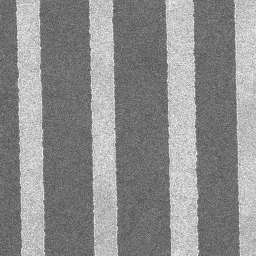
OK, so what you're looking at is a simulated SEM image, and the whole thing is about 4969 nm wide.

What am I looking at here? one or a few lines or trenches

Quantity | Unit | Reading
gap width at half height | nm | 980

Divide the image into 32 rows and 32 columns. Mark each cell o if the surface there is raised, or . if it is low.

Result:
..ooo......ooo.......ooo.....ooo
..ooo......ooo.......ooo.....ooo
..ooo......ooo.......ooo.....ooo
..ooo......ooo.......ooo.....ooo
..ooo......ooo.......ooo.....ooo
..ooo......ooo.......ooo.....ooo
..ooo......ooo.......ooo......oo
..ooo......ooo.......ooo......oo
..ooo......ooo.......ooo......oo
..ooo......ooo.......ooo......oo
..ooo......ooo.......ooo......oo
..ooo......ooo.......ooo......oo
..ooo.......oo.......ooo......oo
..ooo.......oo.......ooo......oo
..ooo.......oo.......ooo......oo
..ooo.......oo.......ooo......oo
...oo.......oo.......ooo......oo
...oo.......oo.......ooo......oo
...oo.......oo.......ooo......oo
...oo.......oo.......oooo.....oo
...oo.......oo.......ooo......oo
...oo.......oo.......ooo......oo
...oo.......oo.......oooo.....oo
...oo.......oo.......oooo.....oo
...oo.......ooo......oooo.....oo
...oo.......ooo......oooo.....oo
...oo.......ooo......oooo.....oo
...oo.......ooo......oooo.....oo
...oo.......ooo......oooo.....oo
...ooo......ooo......oooo.....oo
...oo.......ooo......oooo.....oo
...oo.......ooo......oooo.....oo